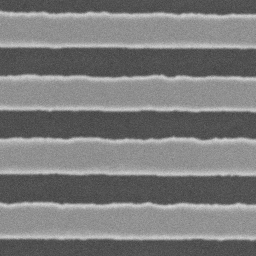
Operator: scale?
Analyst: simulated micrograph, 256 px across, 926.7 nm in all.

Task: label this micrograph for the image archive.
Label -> lines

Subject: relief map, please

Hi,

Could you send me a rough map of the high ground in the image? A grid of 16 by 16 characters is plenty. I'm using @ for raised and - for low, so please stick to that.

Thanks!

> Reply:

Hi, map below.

----------------
@@@@@@@@@@@@@@@@
@@@@@@@@@@@@@@@@
----------------
----------------
@@@@@@@@@@@@@@@@
@@@@@@@@@@@@@@@@
----------------
----------------
@@@@@@@@@@@@@@@@
@@@@@@@@@@@@@@@@
----------------
----------------
@@@@@@@@@@@@@@@@
@@@@@@@@@@@@@@@@
----------------